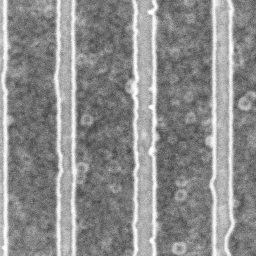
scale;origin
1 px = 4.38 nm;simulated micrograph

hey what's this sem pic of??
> one or a few lines or trenches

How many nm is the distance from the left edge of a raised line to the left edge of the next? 333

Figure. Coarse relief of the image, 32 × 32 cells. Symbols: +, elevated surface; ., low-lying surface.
.++++++..++++++++..++++++++..+++
.++++++..++++++++..++++++++..+++
.++++++..++++++++..++++++++..+++
.++++++..++++++++..++++++++..+++
.++++++..++++++++..++++++++..+++
.++++++..++++++++..++++++++..+++
.++++++..++++++++..++++++++..+++
.++++++..++++++++..++++++++..+++
.++++++..++++++++..++++++++..+++
+++++++..++++++++..++++++++..+++
+++++++..++++++++..++++++++..+++
.++++++..++++++++..++++++++..+++
.++++++..++++++++..++++++++..+++
.++++++..++++++++..++++++++..+++
.++++++..++++++++..++++++++..+++
.++++++..++++++++..++++++++..+++
.++++++..++++++++..++++++++..+++
.++++++..++++++++..++++++++..+++
.++++++..++++++++..++++++++..+++
.+++++++.++++++++..++++++++..+++
.+++++++.++++++++..++++++++..+++
.+++++++.++++++++..++++++++..+++
.++++++..++++++++..++++++++..+++
.++++++..++++++++..++++++++..+++
.++++++..++++++++..++++++++..+++
.++++++..++++++++..++++++++..+++
.++++++..++++++++..++++++++..+++
.++++++..++++++++..++++++++..+++
.++++++..++++++++..++++++++..+++
.++++++..++++++++..++++++++.++++
.++++++..++++++++..++++++++.++++
.++++++..++++++++..++++++++.++++